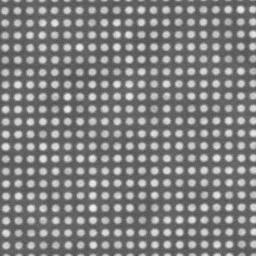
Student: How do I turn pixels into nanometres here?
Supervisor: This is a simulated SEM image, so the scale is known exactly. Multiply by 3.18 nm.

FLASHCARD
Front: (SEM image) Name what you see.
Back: a regular array of raised bodies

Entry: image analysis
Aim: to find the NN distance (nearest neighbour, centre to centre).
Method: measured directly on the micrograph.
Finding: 38.8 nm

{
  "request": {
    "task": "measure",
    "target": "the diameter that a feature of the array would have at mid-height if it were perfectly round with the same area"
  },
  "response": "20.9 nm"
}